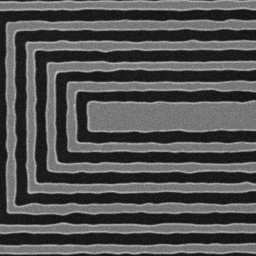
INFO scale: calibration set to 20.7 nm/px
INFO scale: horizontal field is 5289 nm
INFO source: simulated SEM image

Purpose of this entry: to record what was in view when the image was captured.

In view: groups of lines, slits or small figures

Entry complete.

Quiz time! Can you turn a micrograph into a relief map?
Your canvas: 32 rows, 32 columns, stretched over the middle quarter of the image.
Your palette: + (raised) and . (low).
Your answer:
++++++++++++++++++++++++++++++++
+++++++++++++.......++++..++++..
................................
................................
................................
.+++++++++++++++++++++++++++++++
.+++++++++++++.++.+++.........++
.++.............................
.++.............................
.++...+++...++..+......++.......
.++...++++++++++++++++++++++++++
.++...++++++++++++++++++++++++++
.++...++++++++++++++++++++++++++
.++...++++++++++++++++++++++++++
.++...++++++++++++++++++++++++++
.++...++++++++++++++++++++++++++
.++...++++++++++++++++++++++++++
.++.............................
.++.............................
.++.............................
.+++++++++++++++++++++++++++++++
.+++++++++++++++++++++++++++++++
................................
................................
................................
++++++++++++++++++++++++++++++++
++++++++++++++++++++++++++++++++
................................
................................
................................
++++++++++++++++++++++++++++++++
++++++++++++++++++++++++++++++++